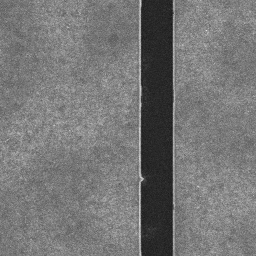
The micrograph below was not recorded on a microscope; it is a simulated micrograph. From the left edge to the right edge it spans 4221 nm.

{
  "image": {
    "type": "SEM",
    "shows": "one or a few lines or trenches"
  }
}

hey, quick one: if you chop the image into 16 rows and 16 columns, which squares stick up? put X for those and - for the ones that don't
XXXXXXXXX--XXXXX
XXXXXXXXX--XXXXX
XXXXXXXXX--XXXXX
XXXXXXXXX--XXXXX
XXXXXXXXX--XXXXX
XXXXXXXXX--XXXXX
XXXXXXXXX--XXXXX
XXXXXXXXX--XXXXX
XXXXXXXXX--XXXXX
XXXXXXXXX--XXXXX
XXXXXXXXX--XXXXX
XXXXXXXXX--XXXXX
XXXXXXXXX--XXXXX
XXXXXXXXX--XXXXX
XXXXXXXXX--XXXXX
XXXXXXXXX--XXXXX